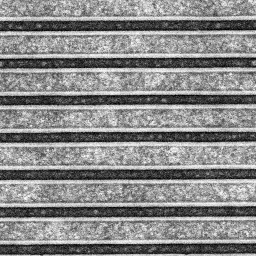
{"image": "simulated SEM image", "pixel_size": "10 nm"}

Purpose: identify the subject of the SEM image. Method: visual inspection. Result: parallel lines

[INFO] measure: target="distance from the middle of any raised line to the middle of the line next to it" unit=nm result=373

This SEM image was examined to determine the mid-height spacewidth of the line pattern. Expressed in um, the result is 0.133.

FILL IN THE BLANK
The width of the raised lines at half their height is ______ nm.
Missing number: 238